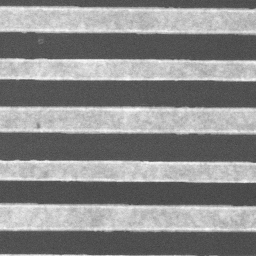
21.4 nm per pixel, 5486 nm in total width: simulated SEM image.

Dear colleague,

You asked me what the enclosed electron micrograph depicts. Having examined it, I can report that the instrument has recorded lines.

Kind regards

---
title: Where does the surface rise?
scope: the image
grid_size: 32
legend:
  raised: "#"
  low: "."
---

................................
################################
################################
################################
................................
................................
................................
####################............
################################
################################
................................
................................
................................
................................
################################
################################
...........................#####
................................
................................
................................
################################
################################
.###############################
................................
................................
................................
################################
################################
################################
................................
................................
................................